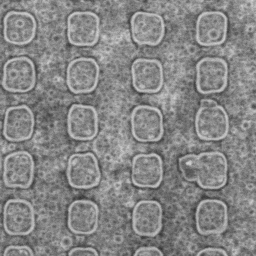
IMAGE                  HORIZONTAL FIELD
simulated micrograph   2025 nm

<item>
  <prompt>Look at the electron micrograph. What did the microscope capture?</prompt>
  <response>a regular array of raised bodies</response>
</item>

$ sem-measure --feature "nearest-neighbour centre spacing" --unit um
0.371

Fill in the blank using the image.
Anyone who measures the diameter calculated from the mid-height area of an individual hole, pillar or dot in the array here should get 261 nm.